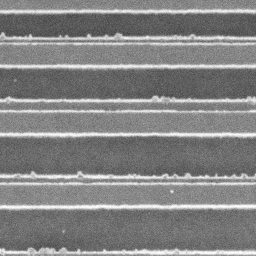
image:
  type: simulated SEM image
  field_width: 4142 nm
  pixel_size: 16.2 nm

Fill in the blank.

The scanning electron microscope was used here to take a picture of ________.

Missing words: lines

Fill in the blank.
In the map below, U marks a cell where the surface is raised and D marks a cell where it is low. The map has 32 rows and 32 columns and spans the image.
UUUUUUUUUUUUUUUUUUUUUUUUUUUUUUUU
DDDDDDDDDDDDDDDDDDDDDDDDDDDDDDDD
DDDDDDDDDDDDDDDDDDDDDDDDDDDDDDDD
DDDDDDDDDDDDDDDDDDDDDDDDDDDDDDDD
UDDDDDDDDDDDDDUDDDDDDDDDDDDDDDDD
UUUUUUUUUUUUUUUUUUUUUUUUUUUUUUUU
UUUUUUUUUUUUUUUUUUUUUUUUUUUUUUUU
UUUUUUUUUUUUUUUUUUUUUUUUUUUUUUUU
DDDDDDDDDDDDDDDDDDDDDDDDDDDDDDDD
DDDDDDDDDDDDDDDDDDDDDDDDDDDDDDDD
DDDDDDDDDDDDDDDDDDDDDDDDDDDDDDDD
DDDDDDDDDDDDDDDDDDDDDDDDDDDDDDDD
UUDDDDDDDDDDDDDDDDDUUUDDDDDDUDUU
UUUUUUUUUUUUUUUUUUUUUUUUUUUUUUUU
UUUUUUUUUUUUUUUUUUUUUUUUUUUUUUUU
UUUUUUUUUUUUUUUUUUUUUUUUUUUUUUUU
UUUUUUUUUUUUUUUUUUUUUUUUUUUUUUUU
DDDDDDDDDDDDDDDDDDDDDDDDDDDDDDDD
DDDDDDDDDDDDDDDDDDDDDDDDDDDDDDDD
DDDDDDDDDDDDDDDDDDDDDDDDDDDDDDDD
DDDDDDDDDDDDDDDDDDDDDDDDDDDDDDDD
DDDDDDDDDDDDDDDDDDDDDDDDDDDDDDDD
UUUUUUUUUUUUUUUUUUUUUUUUUUUUUUUU
UUUUUUUUUUUUUUUUUUUUUUUUUUUUUUUU
UUUUUUUUUUUUUUUUUUUUUUUUUUUUUUUU
UUUUUUUUUUUUUUUUUUUUUUUUUUUUUUUU
DDDDDDDDDDDDDDDDDDDDDDDDDDDDDDDD
DDDDDDDDDDDDDDDDDDDDDDDDDDDDDDDD
DDDDDDDDDDDDDDDDDDDDDDDDDDDDDDDD
DDDDDDDDDDDDDDDDDDDDDDDDDDDDDDDD
DDDDDDDDDDDDDDDDDDDDDDDDDDDDDDDD
UDDUUUUUUUDDDDDDDDDDDDUDDDDUDDDD